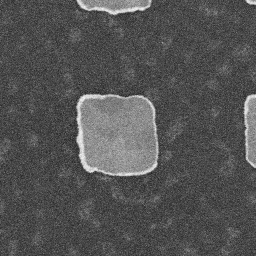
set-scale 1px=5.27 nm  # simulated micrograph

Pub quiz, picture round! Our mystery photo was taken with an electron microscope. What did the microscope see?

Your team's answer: raised bodies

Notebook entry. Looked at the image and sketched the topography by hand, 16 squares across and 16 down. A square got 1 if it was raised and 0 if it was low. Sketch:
0000011110000000
0000000000000000
0000000000000000
0000000000000000
0000000000000000
0000000000000000
0000011110000001
0000011111000001
0000011111000001
0000011111000001
0000011111000000
0000000000000000
0000000000000000
0000000000000000
0000000000000000
0000000000000000